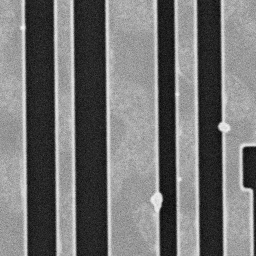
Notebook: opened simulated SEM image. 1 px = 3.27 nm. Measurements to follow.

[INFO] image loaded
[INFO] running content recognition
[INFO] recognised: groups of lines, slits or small figures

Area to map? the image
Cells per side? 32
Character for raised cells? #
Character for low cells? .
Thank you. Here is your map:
###....##....######...##....####
###....##....######...##....####
###....##....#######..##....####
###....##....#######..##....####
###....##....#######..##....####
###....##....#######..###...####
###....##....#######..###...####
###....##....#######..###...####
###....##....#######..###...####
###....##....#######..###...####
###....##....#######..###...####
###....##....#######..###...####
###....##.....######..###...####
###....##.....######..###...####
###....##.....######..###...####
###....##.....######..###..#####
###....##.....######..###...####
###....##.....######..###...####
###....##.....######..###...##..
###....##.....######..###...##..
###....##.....######..###...##..
###....##.....######..###...##..
###....##.....######..###...##..
###....##.....######..###...###.
###....##.....######..###...###.
###....##.....######..###...###.
###....##.....######..###...###.
###....##.....######..###...###.
###....##.....######..###...####
###....##.....######..###...####
###....##.....######..###...####
###....##.....######..###...####